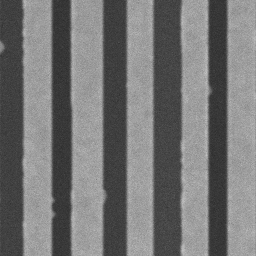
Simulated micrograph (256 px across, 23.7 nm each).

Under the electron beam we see lines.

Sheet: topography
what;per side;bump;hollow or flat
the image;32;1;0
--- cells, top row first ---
00011100011110001110000111000111
00011100011110001110000111000111
00011100011110001110000111000111
00011100011110001110000111000111
00011100011110001110000111000111
00011100011110001110000111000111
00011100011110001110000111000111
00011100011110001110000111000111
00011100011110001110000111000111
00011100011110001110000111000111
00011100011110001110000111000111
00011100011110001110000111000111
00011100011110001110000111000111
00011100011110001110000111000111
00011100011110001110000111000111
00011100011110001110000111000111
00011100011110001110000111000111
00011100011110001110000111000111
00011100011110001110000111000111
00011100011110001110000111000111
00011100011110001110000111000111
00011100011110001110000111000111
00011100011110001110000111000111
00011100011110001110000111000111
00011100011110001110000111000111
00011100011110001110000111000111
00011100011110001110000111000111
00011100011110001110000111000111
00011100011110001110000111000111
00011100011110001110000111000111
00011100011110001110000111000111
00011100011110001110000111000111